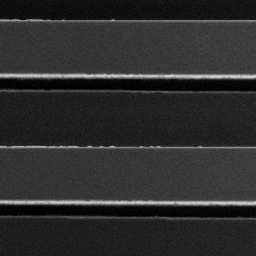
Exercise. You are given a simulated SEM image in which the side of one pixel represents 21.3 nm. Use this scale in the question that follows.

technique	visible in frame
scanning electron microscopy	lines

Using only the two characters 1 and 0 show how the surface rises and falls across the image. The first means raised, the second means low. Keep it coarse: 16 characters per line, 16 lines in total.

0000000000000000
1111111111111111
1111111111111111
1111111111111111
1111111111111111
0000000000000000
0000000000000000
0000000000000000
0000000000000000
1111111111111111
1111111111111111
1111111111111111
1111111111111111
0000000000000000
0000000000000000
0000000000000000